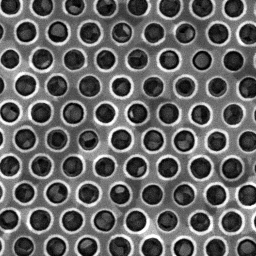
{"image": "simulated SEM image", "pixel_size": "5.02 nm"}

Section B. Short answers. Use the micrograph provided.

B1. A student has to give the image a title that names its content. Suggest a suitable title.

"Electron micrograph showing a regular array of holes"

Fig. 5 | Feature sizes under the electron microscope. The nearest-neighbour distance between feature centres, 155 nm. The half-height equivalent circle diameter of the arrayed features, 104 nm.